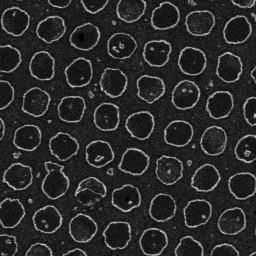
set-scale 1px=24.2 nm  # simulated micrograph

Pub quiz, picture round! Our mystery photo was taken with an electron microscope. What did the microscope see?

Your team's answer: a regular array of raised bodies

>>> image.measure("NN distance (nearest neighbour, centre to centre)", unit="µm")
0.862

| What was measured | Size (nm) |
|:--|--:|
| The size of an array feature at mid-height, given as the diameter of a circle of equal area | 650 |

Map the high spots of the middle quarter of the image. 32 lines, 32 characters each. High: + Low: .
.++++++................+.....+++
+++++++...++++...............+++
+++++++...+++++................+
.++++++..+++++++...++++.........
.+++++...+++++++..+++++++....+++
..+++....+++++++..+++++++...++++
..........+++++....++++++..+++++
......+....+++.....++++++..+++++
++++...............++++....+++++
+++++................+.....+++++
+++++....++++...............++++
+++++...+++++...................
+++++...++++++....+++...........
++++....++++++..++++++..........
........++++++..++++++.....+++..
........+++++..+++++++....++++++
...........+....++++++...+++++++
+................++++....+++++++
++.................++....+++++++
+++.....++................+++++.
+++...+++++.................+...
+++...++++++....+++.............
+++...++++++...+++++............
+.....++++++...++++++...++++....
......+++++...+++++++..++++++..+
........+.....+++++++..++++++...
...........+..++++++...++++++...
...........+.....++....++++++...
+.....++...............++++++...
+...+++++................+++....
+...++++++.....++...............
+..++..+++...+++++..............